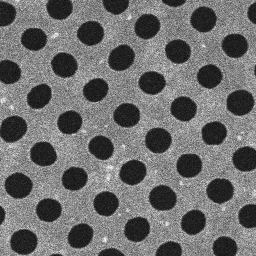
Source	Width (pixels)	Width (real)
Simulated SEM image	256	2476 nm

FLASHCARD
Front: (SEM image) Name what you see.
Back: a regular array of holes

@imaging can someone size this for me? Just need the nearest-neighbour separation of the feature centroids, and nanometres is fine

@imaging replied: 385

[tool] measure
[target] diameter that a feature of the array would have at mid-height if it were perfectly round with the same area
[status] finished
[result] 245 nm